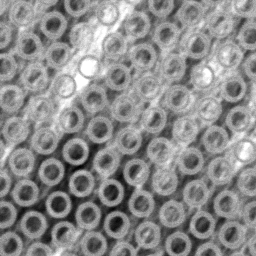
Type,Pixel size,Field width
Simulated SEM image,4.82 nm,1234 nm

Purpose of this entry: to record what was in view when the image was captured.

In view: a regular array of ring-shaped raised bodies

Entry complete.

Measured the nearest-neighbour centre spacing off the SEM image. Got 31.1 pixels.